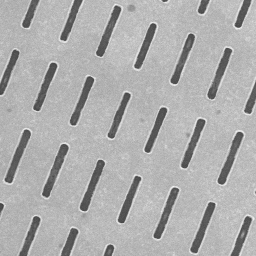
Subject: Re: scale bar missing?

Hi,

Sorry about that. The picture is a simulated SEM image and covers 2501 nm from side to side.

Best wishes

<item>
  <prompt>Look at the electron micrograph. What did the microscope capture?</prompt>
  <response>a regular array of holes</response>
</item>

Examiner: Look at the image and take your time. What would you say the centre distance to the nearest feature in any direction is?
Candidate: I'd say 385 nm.